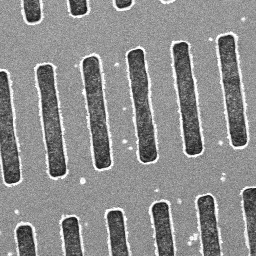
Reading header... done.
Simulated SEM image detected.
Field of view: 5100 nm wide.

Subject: holes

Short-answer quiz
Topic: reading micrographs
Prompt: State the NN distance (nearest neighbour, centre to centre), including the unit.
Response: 911 nanometers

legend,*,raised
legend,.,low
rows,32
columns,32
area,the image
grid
***..****..***..****************
***..****..*********************
***..***************************
********************************
****************************.***
**********************.****..***
****************..****..***..***
***********.****..****..***...**
*****..***...***..****..****..**
.****..***...***..****..****..**
.****..****..***...***..****..**
.****..****..****..***..****..**
.****..****..****..***...***..**
..***..****..****..****..***..**
..***..****..****..****..***...*
..***...***..****..****..****..*
..****..***...***..****..****..*
..****..***...***..****..****..*
..****..****..***...***..*******
..****..****..***...************
..****..****..******************
...***..************************
*.******************************
*******************************.
*************************.****..
*******************..****..***..
**************.****..****..****.
********..***...***..****..****.
**..****..****..***..****..****.
**..****..****..***...***..****.
**..****..****..****..***..****.
**..****..****..****..***...***.